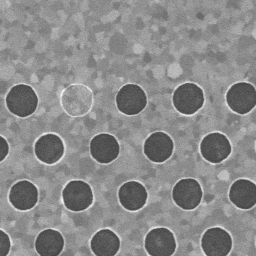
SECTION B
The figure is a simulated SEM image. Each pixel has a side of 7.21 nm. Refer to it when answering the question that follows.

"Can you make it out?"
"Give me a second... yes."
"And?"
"a regular array of holes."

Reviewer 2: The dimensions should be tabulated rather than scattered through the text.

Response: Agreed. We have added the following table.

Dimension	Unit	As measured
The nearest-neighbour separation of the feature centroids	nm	389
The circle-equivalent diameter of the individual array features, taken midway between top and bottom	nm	224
